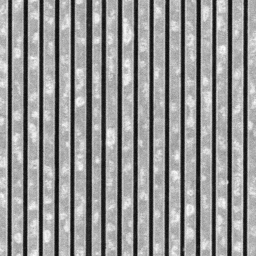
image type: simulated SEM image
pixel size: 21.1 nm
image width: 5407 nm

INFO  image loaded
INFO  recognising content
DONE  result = parallel lines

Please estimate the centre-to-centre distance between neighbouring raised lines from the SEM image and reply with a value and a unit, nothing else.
332 nanometres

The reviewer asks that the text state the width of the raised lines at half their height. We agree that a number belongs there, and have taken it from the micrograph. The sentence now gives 232 nanometers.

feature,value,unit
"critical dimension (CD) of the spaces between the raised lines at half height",0.108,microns